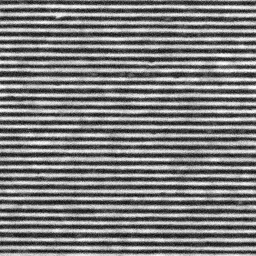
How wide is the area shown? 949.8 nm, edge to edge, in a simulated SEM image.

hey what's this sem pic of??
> parallel lines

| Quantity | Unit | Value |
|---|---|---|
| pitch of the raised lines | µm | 0.0298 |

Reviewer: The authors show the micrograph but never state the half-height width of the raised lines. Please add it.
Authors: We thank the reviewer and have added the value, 3.13 pixels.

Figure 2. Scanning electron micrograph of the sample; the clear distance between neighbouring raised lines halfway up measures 0.0176 micrometres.